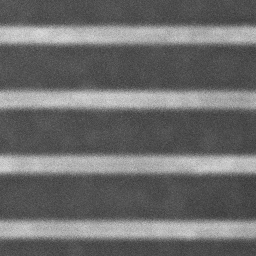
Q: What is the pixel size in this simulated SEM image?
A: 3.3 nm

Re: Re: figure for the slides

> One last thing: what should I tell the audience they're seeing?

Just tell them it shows one or a few lines or trenches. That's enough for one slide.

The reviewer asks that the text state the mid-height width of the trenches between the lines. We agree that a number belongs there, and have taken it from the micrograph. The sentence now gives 174 nm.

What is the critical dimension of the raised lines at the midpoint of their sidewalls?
39.2 nm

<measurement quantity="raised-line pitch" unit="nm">214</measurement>